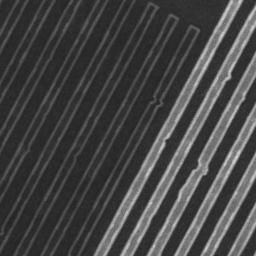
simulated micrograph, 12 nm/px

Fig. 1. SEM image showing parallel lines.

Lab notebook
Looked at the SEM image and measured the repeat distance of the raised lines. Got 0.283 um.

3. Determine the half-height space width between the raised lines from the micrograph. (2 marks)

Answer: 14.8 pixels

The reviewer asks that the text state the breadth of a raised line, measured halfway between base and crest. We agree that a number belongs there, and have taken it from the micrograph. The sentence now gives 104 nanometers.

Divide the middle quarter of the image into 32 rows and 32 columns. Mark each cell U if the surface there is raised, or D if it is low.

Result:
UUDDDDUUUDDDDUUUDDDDUUDDDDUUUDDD
UUDDDDUUDDDDUUUDDDDUUUDDDDUUUDDD
UDDDDUUUDDDDUUUDDDDUUDDDDUUUDDDD
DDDDDUUDDDDUUUDDDDUUUDDDDUUDDDDD
DDDDUUUDDDDUUDDDDDUUDDDDUUUDDDDU
DDDDUUDDDDUUUDDDDUUUDDDDUUDDDDUU
DDDUUUDDDDUUDDDDUUUDDDDUUUDDDDUU
DDDUUDDDDUUUDDDDUUUDDDDUUDDDDUUU
DDUUDDDDUUUDDDDUUUDDDDDUUDDDDUUD
DUUUDDDDUUUDDDDUUDDDDDUUDDDDUUUD
DUUDDDDDUUDDDDUUUDDDDUUUDDDDUUDD
UUUDDDDUUUDDDDUUDDDDDUUDDDDUUUDD
UUDDDDDUUDDDDUUUDDDDUUDDDDDUUDDD
UUDDDDUUUDDDDUUDDDDUUUDDDDUUUDDD
UDDDDDUUDDDDUUUDDDDUUDDDDDUUDDDD
UDDDDUUUDDDDUUDDDDUUUDDDDUUUDDDD
DDDDUUUDDDDUUUDDDDUUDDDDDUUDDDDU
DDDDUUUDDDDUUDDDDUUUDDDDUUDDDDDU
DDDUUUDDDDUUUDDDDUUDDDDDUUDDDDUU
DDDUUDDDDUUUDDDDUUUDDDDUUDDDDDUU
DDUUUDDDDUUUDDDDUUDDDDUUUDDDDUUU
DDUUDDDDUUUDDDDUUUDDDDUUDDDDDUUD
DUUUDDDDUUDDDDDUUDDDDUUUDDDDUUUD
DUUDDDDUUUDDDDUUUDDDDUUDDDDDUUDD
UUUDDDDUUDDDDUUUDDDDUUUDDDDUUUDD
UUDDDDUUUDDDDUUUDDDDUUDDDDUUUDDD
UUDDDDUUDDDDUUUDDDDUUUDDDDUUUDDD
UDDDDUUUDDDDUUDDDDDUUDDDDUUUDDDD
UDDDDUUDDDDUUUDDDDUUUDDDDUUDDDDU
DDDDUUUDDDDUUDDDDDUUDDDDUUUDDDDU
DDDDUUDDDDUUUDDDDUUDDDDDUUDDDDUU
DDDUUUDDDDUUDDDDUUUDDDDUUUDDDUUU